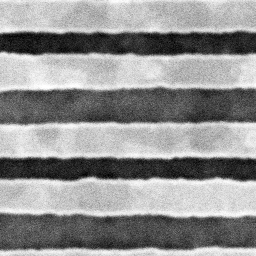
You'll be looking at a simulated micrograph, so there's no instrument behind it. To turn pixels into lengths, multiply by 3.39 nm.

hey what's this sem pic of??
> lines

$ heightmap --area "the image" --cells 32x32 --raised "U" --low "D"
UUUUUUUUUUUUUUUUUUUUUUUUUUUUUUUU
UUUUUUUUUUUUUUUUUUUUUUUUUUUUUUUU
UUUUUUUUUUUUUUUUUUUUUUUUUUUUUUUU
UUUUUUUUUUUUUUUUUUUUUUUUUUUUUUUU
DDDDDDDDDDDDDDDDDDDDDDDDDDDDDDDD
DDDDDDDDDDDDDDDDDDDDDDDDDDDDDDDD
DDDDDDDDDDDDDDDDDDDDDDDDDDDDDDDD
UUUUUUUUUUUUUUUUUUUUUUUUUUUUUUUU
UUUUUUUUUUUUUUUUUUUUUUUUUUUUUUUU
UUUUUUUUUUUUUUUUUUUUUUUUUUUUUUUU
UUUUUUUUUUUUUUUUUUUUUUUUUUUUUUUU
DDDDDDDDDDDDDDDDDDDDDDDDDDDDDDDD
DDDDDDDDDDDDDDDDDDDDDDDDDDDDDDDD
DDDDDDDDDDDDDDDDDDDDDDDDDDDDDDDD
DDDDDDDDDDDDDDDDDDDDDDDDDDDDDDDD
DDDDDDDDDUUUUUUDUUUUUUDUUUUUUUUU
UUUUUUUUUUUUUUUUUUUUUUUUUUUUUUUU
UUUUUUUUUUUUUUUUUUUUUUUUUUUUUUUU
UUUUUUUUUUUUUUUUUUUUUUUUUUUUUUUU
UUUUUUUUUUUUUUUUUUUUUUUUUUUUUUUU
DDDDDDDDDDDDDDDDDDDDDDDDDDDDDDDD
DDDDDDDDDDDDDDDDDDDDDDDDDDDDDDDD
DDDDUDDDDDUUUDDDDDDUDDUDDDUUDDDD
UUUUUUUUUUUUUUUUUUUUUUUUUUUUUUUU
UUUUUUUUUUUUUUUUUUUUUUUUUUUUUUUU
UUUUUUUUUUUUUUUUUUUUUUUUUUUUUUUU
DUUUUUUUUUUUUUUUUUUUUUUUUUUUUUUU
DDDDDDDDDDDDDDDDDDDDDDDDDDDDDDDD
DDDDDDDDDDDDDDDDDDDDDDDDDDDDDDDD
DDDDDDDDDDDDDDDDDDDDDDDDDDDDDDDD
DDDDDDDDDDDDDDDDDDDDDDDDDDDDDDDD
UUUUUUUUUUUUUUUUUUUUUUUUUUUUUUUU